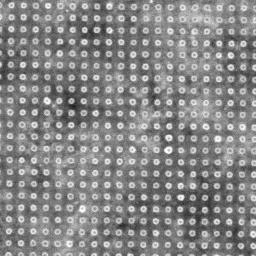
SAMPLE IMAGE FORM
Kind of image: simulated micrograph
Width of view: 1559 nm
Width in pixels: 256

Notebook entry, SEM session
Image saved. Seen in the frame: a regular array of raised bodies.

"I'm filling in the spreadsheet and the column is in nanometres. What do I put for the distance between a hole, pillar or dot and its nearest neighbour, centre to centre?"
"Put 71.1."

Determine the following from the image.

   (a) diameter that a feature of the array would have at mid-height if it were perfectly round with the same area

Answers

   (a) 33.7 nm